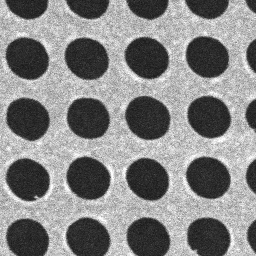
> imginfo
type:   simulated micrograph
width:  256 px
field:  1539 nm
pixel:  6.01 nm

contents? a regular array of holes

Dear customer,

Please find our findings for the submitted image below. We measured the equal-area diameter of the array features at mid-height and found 259 nm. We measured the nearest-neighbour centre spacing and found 0.359 microns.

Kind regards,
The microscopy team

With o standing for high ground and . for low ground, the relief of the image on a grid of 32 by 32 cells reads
o.....oo......oo.....oo......oo.
o.....ooo....oooo....ooo....oooo
ooo.oooooooooooooooooooooooooooo
oooooooooooooooooooooooooooooooo
oooooooooooooooooooooooooooooooo
o....oooo....ooo....oooo....ooo.
o.....oo.....ooo.....oo......oo.
o.....oo......oo.....oo......oo.
o.....ooo....ooo.....ooo....ooo.
oo...ooooo...oooo...ooooo..ooooo
oooooooooooooooooooooooooooooooo
oooooooooooooooooooooooooooooooo
oo...oooo...ooooo...oooo....oooo
o.....ooo....ooo.....ooo....ooo.
o.....oo......oo.....oo......oo.
o.....ooo.....oo.....ooo.....oo.
oo....ooo....ooo.....oooo...oooo
ooo..ooooooooooooo.ooooooooooooo
oooooooooooooooooooooooooooooooo
oooooooooooooooooooooooooooooooo
o....oooo....ooo....oooo....ooo.
o.....oo......oo.....oo......oo.
o.....oo......oo.....oo......oo.
o.....ooo.....oo.....ooo.....oo.
oo...ooooo...oooo...ooooo...oooo
oooooooooooooooooooooooooooooooo
oooooooooooooooooooooooooooooooo
oo..oooooo..ooooo...oooo...ooooo
o.....oo.....ooo.....oo.....ooo.
o.....oo......oo.....oo......oo.
o.....oo......oo.....ooo.....oo.
o.....ooo....oooo....ooo....oooo